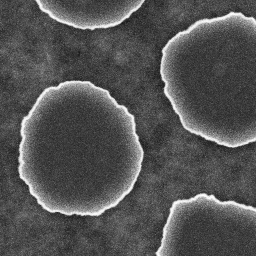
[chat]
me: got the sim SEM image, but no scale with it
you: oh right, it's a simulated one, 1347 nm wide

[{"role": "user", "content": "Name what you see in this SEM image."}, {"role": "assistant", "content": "raised bodies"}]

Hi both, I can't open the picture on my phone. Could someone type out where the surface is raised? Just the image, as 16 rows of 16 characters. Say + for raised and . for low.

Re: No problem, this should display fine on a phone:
...++++++.......
....+++.....++++
...........+++++
..........++++++
..........++++++
...+++....++++++
..+++++....+++++
..++++++...+++++
.++++++++....+++
.++++++++.......
.++++++++.......
..++++++........
..++++++....++..
...........+++++
..........++++++
..........++++++